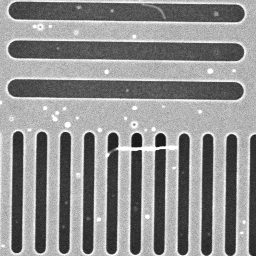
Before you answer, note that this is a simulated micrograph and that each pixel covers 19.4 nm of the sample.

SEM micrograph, groups of lines, slits or small figures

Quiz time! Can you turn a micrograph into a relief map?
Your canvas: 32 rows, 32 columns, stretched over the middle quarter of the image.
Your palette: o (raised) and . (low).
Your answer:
oooooooooooooooooooooooooooooooo
oooooooooooooooooooooooooooooooo
oooooooooooooooooooooooooooooooo
oooooooooooooooooooooooooooooooo
................................
................................
................................
................................
................................
oooooooooooooooooooooooooooooooo
oooooooooooooooooooooooooooooooo
oooooooooooooooooooooooooooooooo
oooooooooooooooooooooooooooooooo
oooooooooooooooooooooooooooooooo
oooooooooooooooooooooooooooooooo
oooooooooooooooooooooooooooooooo
oooooooooooooooooooooooooooooooo
..ooo..oooo..oooo..oooo..oooo..o
..ooo...ooo...ooo...ooo..oooo..o
..ooo...ooo...ooo...ooo...oo...o
..ooo...ooo...ooo...ooo..ooo...o
..ooo...ooo..oooo..oooo..ooo...o
..ooo...ooo...ooo...ooo...oo...o
..ooo...ooo...ooo...ooo...oo...o
..ooo...ooo...ooo...oo....oo...o
..ooo...ooo...ooo...oo....oo...o
..ooo...ooo...ooo...oo...ooo...o
..ooo...ooo...ooo...oo...ooo...o
..ooo...ooo...ooo...oo...ooo...o
..ooo...ooo...ooo...oo...ooo...o
..ooo...ooo...ooo...oo...ooo...o
..ooo...ooo...oo....oo...ooo...o